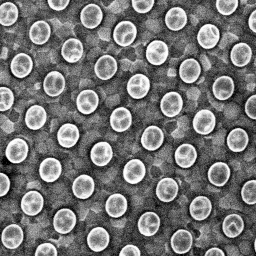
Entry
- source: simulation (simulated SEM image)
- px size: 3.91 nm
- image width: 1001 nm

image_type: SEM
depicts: a regular array of raised bodies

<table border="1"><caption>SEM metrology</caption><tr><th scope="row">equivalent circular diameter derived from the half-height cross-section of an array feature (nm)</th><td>86.6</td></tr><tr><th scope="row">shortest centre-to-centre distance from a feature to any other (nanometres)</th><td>146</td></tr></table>